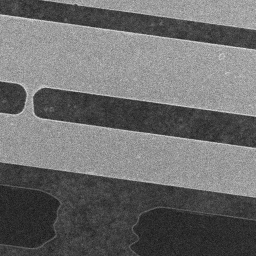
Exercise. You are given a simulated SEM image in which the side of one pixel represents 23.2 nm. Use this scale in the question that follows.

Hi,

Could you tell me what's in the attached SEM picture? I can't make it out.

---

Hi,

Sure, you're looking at one or a few lines or trenches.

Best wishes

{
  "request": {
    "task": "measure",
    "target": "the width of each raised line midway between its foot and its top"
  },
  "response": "1.28 µm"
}